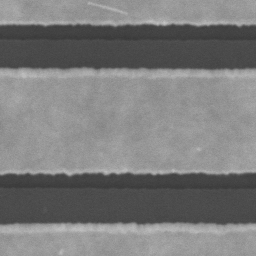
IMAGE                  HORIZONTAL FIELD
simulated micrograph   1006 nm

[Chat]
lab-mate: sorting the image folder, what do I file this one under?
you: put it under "lines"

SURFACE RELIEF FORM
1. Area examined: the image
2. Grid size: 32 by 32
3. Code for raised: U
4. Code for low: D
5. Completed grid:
UUUUUUUUUUUUUUUUUUUUUUUUUUUUUUUU
UUUUUUUUUUUUUUUUUUUUUUUUUUUUUUUU
UUUUUUUUUUUUUUUUUUUUUUUUUUUUUUUU
DDDDDDDDDDDDDDDDDDDDDDDDDDDDDDDD
DDDDDDDDDDDDDDDDDDDDDDDDDDDDDDDD
DDDDDDDDDDDDDDDDDDDDDDDDDDDDDDDD
DDDDDDDDDDDDDDDDDDDDDDDDDDDDDDDD
DDDDDDDDDDDDDDDDDDDDDDDDDDDDDDDD
DDDDDDDDDDDDDDDDDDDDDDDDDDDDDDDD
UUUUUUUUUUUUUUUUUUUUUUUUUUUUUUUU
UUUUUUUUUUUUUUUUUUUUUUUUUUUUUUUU
UUUUUUUUUUUUUUUUUUUUUUUUUUUUUUUU
UUUUUUUUUUUUUUUUUUUUUUUUUUUUUUUU
UUUUUUUUUUUUUUUUUUUUUUUUUUUUUUUU
UUUUUUUUUUUUUUUUUUUUUUUUUUUUUUUU
UUUUUUUUUUUUUUUUUUUUUUUUUUUUUUUU
UUUUUUUUUUUUUUUUUUUUUUUUUUUUUUUU
UUUUUUUUUUUUUUUUUUUUUUUUUUUUUUUU
UUUUUUUUUUUUUUUUUUUUUUUUUUUUUUUU
UUUUUUUUUUUUUUUUUUUUUUUUUUUUUUUU
UUUUUUUUUUUUUUUUUUUUUUUUUUUUUUUU
UUUUUUUUUUUUUUUUUUUUUUUUUUUUUUUU
DDDDDDDDDDDDDDDDDDDDDDDDDDDDDDDD
DDDDDDDDDDDDDDDDDDDDDDDDDDDDDDDD
DDDDDDDDDDDDDDDDDDDDDDDDDDDDDDDD
DDDDDDDDDDDDDDDDDDDDDDDDDDDDDDDD
DDDDDDDDDDDDDDDDDDDDDDDDDDDDDDDD
DDDDDDDDDDDDDDDDDDDDDDDDDDDDDDDD
UUUUUUUUUUUUUUUUUUUUUUUUUUUUUUUU
UUUUUUUUUUUUUUUUUUUUUUUUUUUUUUUU
UUUUUUUUUUUUUUUUUUUUUUUUUUUUUUUU
UUUUUUUUUUUUUUUUUUUUUUUUUUUUUUUU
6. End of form